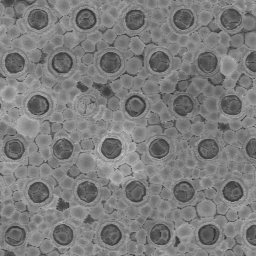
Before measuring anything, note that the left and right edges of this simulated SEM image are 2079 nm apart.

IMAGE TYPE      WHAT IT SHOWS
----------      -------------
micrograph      a regular array of holes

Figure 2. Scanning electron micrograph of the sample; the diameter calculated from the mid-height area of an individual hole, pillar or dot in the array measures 166 nm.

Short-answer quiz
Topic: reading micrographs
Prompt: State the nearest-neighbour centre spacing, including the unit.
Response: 219 nm